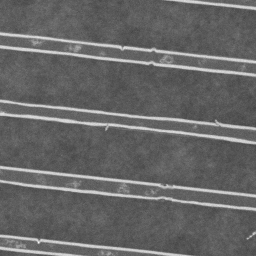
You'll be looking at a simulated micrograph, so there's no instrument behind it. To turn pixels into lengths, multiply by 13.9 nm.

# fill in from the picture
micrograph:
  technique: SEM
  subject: one or a few lines or trenches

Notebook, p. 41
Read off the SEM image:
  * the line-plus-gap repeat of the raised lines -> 66.8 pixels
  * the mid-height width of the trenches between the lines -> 744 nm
